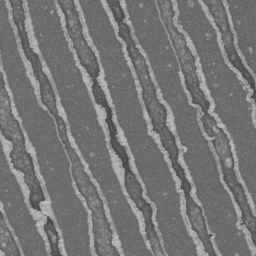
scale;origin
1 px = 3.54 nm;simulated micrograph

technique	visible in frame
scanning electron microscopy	parallel lines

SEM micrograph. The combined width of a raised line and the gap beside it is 0.166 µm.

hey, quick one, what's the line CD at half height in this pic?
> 123 nm